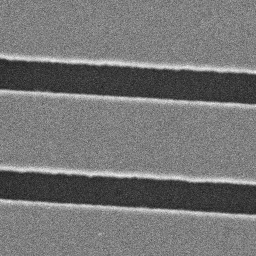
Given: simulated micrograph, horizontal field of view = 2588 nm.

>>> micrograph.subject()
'lines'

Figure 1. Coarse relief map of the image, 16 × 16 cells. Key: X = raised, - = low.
XXXXXXXXXXXXXXXX
XXXXXXXXXXXXXXXX
XXXXXXXXXXXXXXXX
XXXXXXXXXXXXXXXX
---------------X
----------------
XXXXXXXXXXXXXXX-
XXXXXXXXXXXXXXXX
XXXXXXXXXXXXXXXX
XXXXXXXXXXXXXXXX
XXXXXXXXXXXXXXXX
----------------
----------------
XXXXXXXXXXXXXXXX
XXXXXXXXXXXXXXXX
XXXXXXXXXXXXXXXX